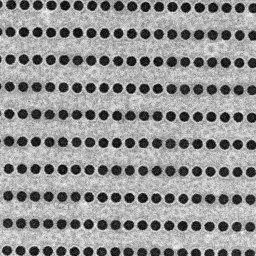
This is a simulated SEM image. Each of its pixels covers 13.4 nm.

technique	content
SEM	a regular array of holes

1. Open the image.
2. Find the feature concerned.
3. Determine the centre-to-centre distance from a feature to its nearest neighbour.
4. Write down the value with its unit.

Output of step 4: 179 nm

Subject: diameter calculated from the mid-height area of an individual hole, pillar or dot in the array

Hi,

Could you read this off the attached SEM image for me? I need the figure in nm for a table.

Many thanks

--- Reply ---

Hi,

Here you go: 146